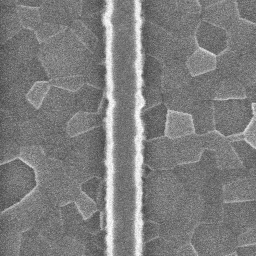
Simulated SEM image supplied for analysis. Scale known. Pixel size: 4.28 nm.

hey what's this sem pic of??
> one or a few lines or trenches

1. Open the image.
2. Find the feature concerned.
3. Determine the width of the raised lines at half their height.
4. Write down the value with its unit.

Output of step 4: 126 nanometres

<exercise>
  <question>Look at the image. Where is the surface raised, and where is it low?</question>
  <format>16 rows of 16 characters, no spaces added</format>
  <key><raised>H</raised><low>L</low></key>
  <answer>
LLLLLLLHHLLLLLLL
LLLLLLLHHLLLLLLL
LLLLLLLHHLLLLLLL
LLLLLLLHHLLLLLLL
LLLLLLLHHLLLLLLL
LLLLLLLHHLLLLLLL
LLLLLLLHHLLLLLLL
LLLLLLLHHLLLLLLL
LLLLLLLHHLLLLLLL
LLLLLLLHHLLLLLLL
LLLLLLLHHLLLLLLL
LLLLLLLHHLLLLLLL
LLLLLLLHHLLLLLLL
LLLLLLLHHLLLLLLL
LLLLLLLHHLLLLLLL
LLLLLLLHHLLLLLLL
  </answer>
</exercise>